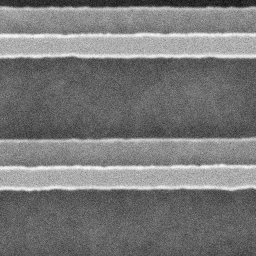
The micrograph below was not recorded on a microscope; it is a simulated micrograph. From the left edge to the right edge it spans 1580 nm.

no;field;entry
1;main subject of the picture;lines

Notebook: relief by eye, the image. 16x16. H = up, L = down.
HLLHHHLLHHHLHHHH
HHHHHHHHHHHHHHHH
HHHHHHHHHHHHHHHH
HHHHHHHHHHHHHHHH
LLLLLLLLLLLLLLLL
LLLLLLLLLLLLLLLL
LLLLLLLLLLLLLLLL
LLLLLLLLLLLLLLLL
LLLLLLLLLLLLLLLL
HHHHHHHHHHHHHHHH
HHHHHHHHHHHHHHHH
HHHHHHHHHHHHHHHH
LLLLLLLLLLLLLLLL
LLLLLLLLLLLLLLLL
LLLLLLLLLLLLLLLL
LLLLLLLLLLLLLLLL